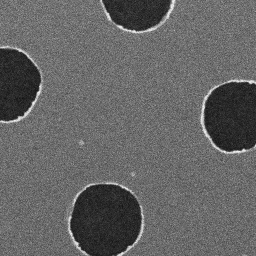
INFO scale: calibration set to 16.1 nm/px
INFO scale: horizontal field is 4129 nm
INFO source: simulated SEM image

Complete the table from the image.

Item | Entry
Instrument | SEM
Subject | holes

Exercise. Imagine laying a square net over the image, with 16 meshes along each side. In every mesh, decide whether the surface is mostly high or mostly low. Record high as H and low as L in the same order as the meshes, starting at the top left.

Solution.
HHHHHHHLLLLHHHHH
HHHHHHHLLLHHHHHH
HHHHHHHHHHHHHHHH
LLHHHHHHHHHHHHHH
LLHHHHHHHHHHHHHH
LLHHHHHHHHHHHHLL
LLHHHHHHHHHHHLLL
LHHHHHHHHHHHHLLL
HHHHHHHHHHHHHLLL
HHHHHHHHHHHHHHHH
HHHHHHHHHHHHHHHH
HHHHHHHHHHHHHHHH
HHHHHLLLLHHHHHHH
HHHHLLLLLHHHHHHH
HHHHLLLLLHHHHHHH
HHHHHLLLHHHHHHHH